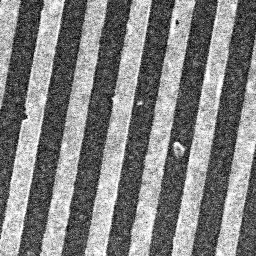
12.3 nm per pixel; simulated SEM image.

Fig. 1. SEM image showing parallel lines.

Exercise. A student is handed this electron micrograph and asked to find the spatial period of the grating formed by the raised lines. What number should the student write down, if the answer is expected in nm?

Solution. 527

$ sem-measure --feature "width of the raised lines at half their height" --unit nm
224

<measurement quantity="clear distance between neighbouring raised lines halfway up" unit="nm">307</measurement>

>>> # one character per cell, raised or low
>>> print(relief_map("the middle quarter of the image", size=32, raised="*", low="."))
...*****......*****......**.*...
...*****......*****......****...
...****.......****.......****...
...****.......****......*****...
..*****......*****......**..*...
..*****......*****......*****...
..*****......*****......****....
..****.......****.......****....
..****......**.**......*****....
..****.......****......*****....
.*****......*****......*****....
.*****......*****......****.....
.***.*......*****......****.....
.***........****.......****.....
.****.......****......*****.....
*****......*****......*****.....
*****......*****......*****.....
*****......*****......****......
*****......****.......****......
****.......****......*****......
****.......****......*****..*...
****......*****......***.*..**..
****......*****......****...*...
****......*****......****......*
***.......****.......****......*
***.......****......*****......*
***......*****......*****......*
***......*****......*****......*
***......*****......****.......*
**.......****.......****......**
**.......****......*****......**
**.......****......*****......**